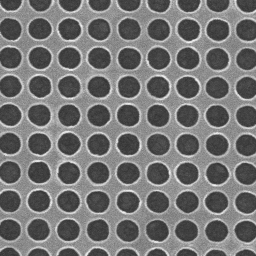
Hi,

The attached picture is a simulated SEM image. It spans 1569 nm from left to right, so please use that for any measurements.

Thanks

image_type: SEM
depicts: a regular array of holes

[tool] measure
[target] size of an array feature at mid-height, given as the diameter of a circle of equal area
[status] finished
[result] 22.7 pixels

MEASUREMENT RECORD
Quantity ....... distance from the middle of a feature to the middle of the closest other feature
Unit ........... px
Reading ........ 28.6